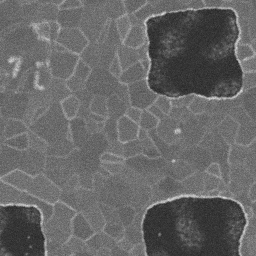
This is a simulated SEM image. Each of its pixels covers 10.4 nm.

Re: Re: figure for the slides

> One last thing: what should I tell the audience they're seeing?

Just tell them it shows holes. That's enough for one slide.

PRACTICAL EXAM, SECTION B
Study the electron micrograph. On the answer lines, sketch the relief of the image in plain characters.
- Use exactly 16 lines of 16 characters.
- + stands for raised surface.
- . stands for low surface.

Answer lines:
++++++++++++++++
+++++++++......+
+++++++++......+
+++++++++......+
+++++++++......+
+++++++++......+
++++++++++++++++
++++++++++++++++
++++++++++++++++
++++++++++++++++
++++++++++++++++
++++++++++++++++
+++++++++++...++
...++++++......+
...++++++......+
...++++++......+